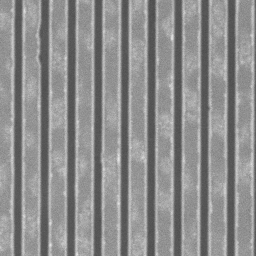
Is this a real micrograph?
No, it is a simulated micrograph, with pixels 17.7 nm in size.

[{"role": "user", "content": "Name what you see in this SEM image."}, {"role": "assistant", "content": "parallel lines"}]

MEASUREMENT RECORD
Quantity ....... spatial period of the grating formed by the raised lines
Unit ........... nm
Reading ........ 472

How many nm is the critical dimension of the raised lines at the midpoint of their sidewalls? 305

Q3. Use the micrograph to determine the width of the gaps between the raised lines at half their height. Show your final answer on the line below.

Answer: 173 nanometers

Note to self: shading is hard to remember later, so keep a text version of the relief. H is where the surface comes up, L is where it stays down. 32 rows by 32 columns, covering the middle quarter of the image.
LLLHHHHLLLHHHHLLHHHHHLLHHHHLLLHH
LLLHHHHLLLHHHHLLHHHHHLLHHHHLLLHH
LLLHHHHLLLHHHHLLHHHHHLLHHHHLLLHH
LLLHHHHLLLHHHHLLHHHHHLLHHHHLLLHH
LLLHHHHLLLHHHHLLHHHHHLLHHHHLLLHH
LLLHHHHLLLHHHHLLHHHHHLLHHHHLLLHH
LLLHHHHLLLHHHHLLHHHHHLLHHHHLLLHH
LLLHHHHLLLHHHHLLHHHHHLLHHHHLLLHH
LLLHHHHLLLHHHHLLHHHHHLLHHHHLLLHH
HLLHHHHLLLHHHHLLHHHHHLLHHHHLLLHH
HLLHHHHLLLHHHHLLHHHHHLLHHHHLLLHH
LLLHHHHLLLHHHHLLHHHHHLLHHHHLLLHH
LLLHHHHLLLHHHHLLHHHHHLLHHHHLLLHH
LLLHHHHLLLHHHHLLHHHHHLLHHHHLLLHH
LLLHHHHLLLHHHHLLHHHHHLLHHHHLLLHH
HLLHHHHLLLHHHHLLHHHHHLLHHHHLLLHH
LLLHHHHLLLHHHHLLHHHHHLLHHHHLLLHH
LLLHHHHLLLHHHHLLHHHHHLLHHHHLLLHH
LLLHHHHLLLHHHHLLHHHHHLLHHHHLLLHH
LLLHHHHLLLHHHHLLHHHHHLLHHHHLLLHH
HLLHHHHLLLHHHHLLHHHHHLLHHHHLLLHH
LLLHHHHLLLHHHHLLHHHHHLLHHHHLLLHH
HLLHHHHLLHHHHHLLHHHHHLLHHHHLLLHH
HLLHHHHLLHHHHHLLHHHHHLLHHHHLLLHH
HLLHHHHLLHHHHHLLHHHHHLLHHHHLLLHH
LLLHHHHLLLHHHHLLHHHHHLLHHHHLLLHH
LLLHHHHLLLHHHHLLHHHHHLLHHHHLLLHH
LLLHHHHLLLHHHHLLLHHHHLLHHHHLLLHH
LLLHHHHLLLHHHHLLLHHHHLLHHHHLLLHH
LLLHHHHLLLHHHHLLHHHHHLLHHHHLLLHH
LLLHHHHLLLHHHHLLHHHHHLLHHHHLLLHH
LLLHHHHLLLHHHHLLHHHHHLLHHHHLLLHH